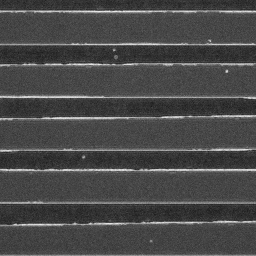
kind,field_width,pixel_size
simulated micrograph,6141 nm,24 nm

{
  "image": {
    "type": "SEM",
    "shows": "lines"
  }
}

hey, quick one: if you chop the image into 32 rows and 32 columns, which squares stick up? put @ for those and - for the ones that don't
--------------------------------
@@@@@@@@@@@@@@@@@@@@@@@@@@@@@@@@
@@@@@@@@@@@@@@@@@@@@@@@@@@@@@@@@
@@@@@@@@@@@@@@@@@@@@@@@@@@@@@@@@
@@@@@@@@@@@@@@@@@@@@@@@@@@@@@@@@
@@@@@@@@@@@@@@@@@@@@@@@@@@@@@@@@
--------------------------------
--------------------------------
@@@@@@@@@@@@@@@@@@@@@@@@@@@@@@@@
@@@@@@@@@@@@@@@@@@@@@@@@@@@@@@@@
@@@@@@@@@@@@@@@@@@@@@@@@@@@@@@@@
@@@@@@@@@@@@@@@@@@@@@@@@@@@@@@@@
--------------------------------
--------------------------------
--------------------------------
@@@@@@@@@@@@@@@@@@@@@@@@@@@@@@@@
@@@@@@@@@@@@@@@@@@@@@@@@@@@@@@@@
@@@@@@@@@@@@@@@@@@@@@@@@@@@@@@@@
@@@@@@@@@@@@@@@@@@@@@@@@@@@@@@@@
--------------------------------
--------------------------------
@@@@@@@@@@@@@@@@@@@@@@@@@@@@@@@@
@@@@@@@@@@@@@@@@@@@@@@@@@@@@@@@@
@@@@@@@@@@@@@@@@@@@@@@@@@@@@@@@@
@@@@@@@@@@@@@@@@@@@@@@@@@@@@@@@@
--------------------------------
--------------------------------
--------------------------------
@@@@@@@@@@@@@@@@@@@@@@@@@@@@@@@@
@@@@@@@@@@@@@@@@@@@@@@@@@@@@@@@@
@@@@@@@@@@@@@@@@@@@@@@@@@@@@@@@@
@@@@@@@@@@@@@@@@@@@@@@@@@@@@@@@@